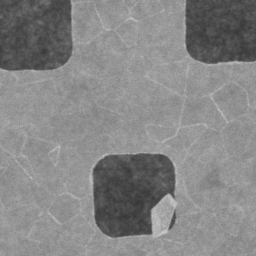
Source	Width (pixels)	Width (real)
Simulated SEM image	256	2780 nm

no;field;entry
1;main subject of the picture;holes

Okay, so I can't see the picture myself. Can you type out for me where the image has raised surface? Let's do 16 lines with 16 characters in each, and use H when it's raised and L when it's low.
LLLLHHHHHHHHLLLL
LLLLHHHHHHHHLLLL
LLLLLHHHHHHHLLLL
LLLLHHHHHHHHLLLL
HHHHHHHHHHHHHHHH
HHHHHHHHHHHHHHHH
HHHHHHHHHHHHHHHH
HHHHHHHHHHHHHHHH
HHHHHHHHHHHHHHHH
HHHHHHHHHHHHHHHH
HHHHHHLLLLLHHHHH
HHHHHHLLLLLHHHHH
HHHHHHLLLLHHHHHH
HHHHHHLLLHHHHHHH
HHHHHHLLLHHHHHHH
HHHHHHHHHHHHHHHH